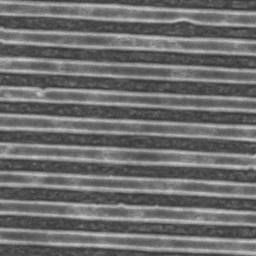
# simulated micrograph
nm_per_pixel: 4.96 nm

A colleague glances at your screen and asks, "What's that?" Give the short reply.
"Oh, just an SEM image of parallel lines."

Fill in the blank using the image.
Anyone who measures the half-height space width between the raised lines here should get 75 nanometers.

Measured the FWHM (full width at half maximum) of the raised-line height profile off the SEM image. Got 0.0663 microns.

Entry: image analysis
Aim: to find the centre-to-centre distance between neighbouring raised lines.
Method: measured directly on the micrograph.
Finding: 141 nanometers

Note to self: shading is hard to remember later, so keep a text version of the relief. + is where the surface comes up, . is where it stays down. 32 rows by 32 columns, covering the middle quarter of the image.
+++++++++++++++++++++++.........
++++++++++++++++++++++++++++++++
++++++++++++++++++++++++++++++++
....................++++++++++++
................................
................................
.+++............................
++++++++++++++++++..............
++++++++++++++++++++++++++++++++
.+++++++++++++++++++++++++++++++
.....................+++++++++++
................................
................................
+...............................
+++++++++++++++++++.............
++++++++++++++++++++++++++++++++
++++++++++++++++++++++++++++++++
....................++++++++++++
................................
................................
................................
++++++++++++++++++++............
++++++++++++++++++++++++++++++++
++++++++++++++++++++++++++++++++
.............+++++++++++++++++++
................................
................................
................................
+++++++++++++...................
++++++++++++++++++++++++++++++++
++++++++++++++++++++++++++++++++
..............++++++++++++++++++